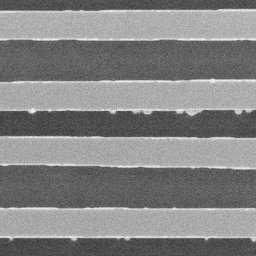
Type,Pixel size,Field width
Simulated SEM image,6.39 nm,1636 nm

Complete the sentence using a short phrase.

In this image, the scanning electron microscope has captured lines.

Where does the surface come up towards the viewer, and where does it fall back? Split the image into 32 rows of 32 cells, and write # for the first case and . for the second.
................................
################################
################################
################################
################################
................................
................................
................................
................................
................................
################################
################################
################################
################################
................................
................................
................................
################################
################################
################################
################################
................................
................................
................................
................................
................................
################################
################################
################################
################################
................................
................................